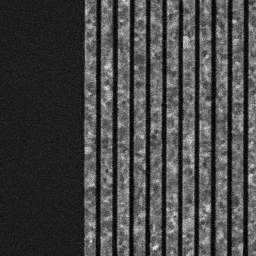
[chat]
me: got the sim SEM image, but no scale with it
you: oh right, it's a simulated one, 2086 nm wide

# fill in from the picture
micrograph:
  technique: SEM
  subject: parallel lines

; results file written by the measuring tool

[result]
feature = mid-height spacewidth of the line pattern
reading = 47.9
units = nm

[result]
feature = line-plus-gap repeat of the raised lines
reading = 133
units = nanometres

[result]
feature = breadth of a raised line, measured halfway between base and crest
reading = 88.7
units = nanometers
